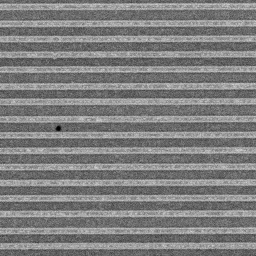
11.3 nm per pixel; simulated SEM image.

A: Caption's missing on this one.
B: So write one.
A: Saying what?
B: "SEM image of parallel lines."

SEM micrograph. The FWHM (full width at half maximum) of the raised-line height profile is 55.1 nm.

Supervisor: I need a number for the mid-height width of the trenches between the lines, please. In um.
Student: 0.12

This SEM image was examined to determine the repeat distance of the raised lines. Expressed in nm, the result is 180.